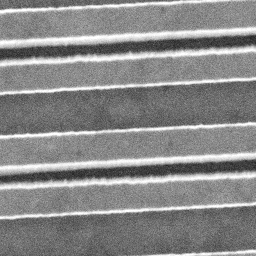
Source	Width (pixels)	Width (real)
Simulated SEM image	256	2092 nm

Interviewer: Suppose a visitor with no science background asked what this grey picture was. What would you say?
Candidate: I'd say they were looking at lines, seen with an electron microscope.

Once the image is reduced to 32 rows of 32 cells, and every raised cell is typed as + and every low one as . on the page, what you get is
..................++++++++++++++
++++++++++++++++++++++++++++++++
++++++++++++++++++++++++++++++++
++++++++++++++++++++++++++++++++
+++++++++++++++++++.............
+...............................
..........................+.++++
.........+++++++++++++++++++++++
++++++++++++++++++++++++++++++++
++++++++++++++++++++++++++++++++
+++++++++++++++++++++...........
++++............................
................................
................................
................................
...............................+
............++++++++++++++++++++
++++++++++++++++++++++++++++++++
++++++++++++++++++++++++++++++++
++++++++++++++++++++++++++++++..
++++++++++++....................
................................
....................++++++++++++
++++++++++++++++++++++++++++++++
++++++++++++++++++++++++++++++++
++++++++++++++++++++++++++++++++
+++++++++++++++.................
................................
................................
................................
................................
..............................++